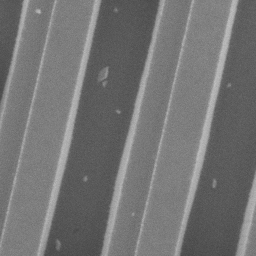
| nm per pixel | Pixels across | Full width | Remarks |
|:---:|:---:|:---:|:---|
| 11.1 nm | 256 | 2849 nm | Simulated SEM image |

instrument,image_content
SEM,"lines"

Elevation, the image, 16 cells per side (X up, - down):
--XXXX----XXXXX-
-XXXXX----XXXX--
-XXXXX----XXXX--
-XXXX----XXXXX--
-XXXX----XXXXX--
XXXXX----XXXX---
XXXXX----XXXX---
XXXX----XXXXX---
XXXX----XXXXX---
XXXX----XXXXX---
XXXX----XXXX----
XXXX----XXXX----
XXX----XXXXX----
XXX----XXXXX----
XXX----XXXX----X
XXX----XXXX----X